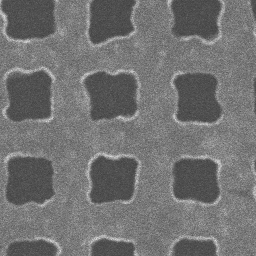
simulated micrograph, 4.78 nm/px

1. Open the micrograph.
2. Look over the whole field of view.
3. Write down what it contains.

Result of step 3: holes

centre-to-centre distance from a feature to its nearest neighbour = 0.394 micrometres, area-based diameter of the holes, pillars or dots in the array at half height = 238 nanometers